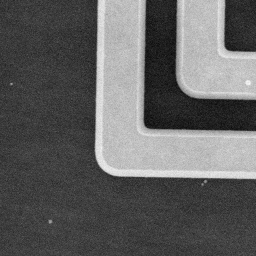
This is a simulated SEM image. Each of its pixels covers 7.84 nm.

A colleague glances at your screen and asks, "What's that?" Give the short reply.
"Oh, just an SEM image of groups of lines, slits or small figures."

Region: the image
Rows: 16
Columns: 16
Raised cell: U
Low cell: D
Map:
DDDDDDUUUDDUUUDD
DDDDDDUUUDDUUUDD
DDDDDDUUUDDUUUDD
DDDDDDUUUDDUUUUU
DDDDDDUUUDDUUUUU
DDDDDDUUUDDDUUUU
DDDDDDUUUDDDDDDD
DDDDDDUUUDDDDDDD
DDDDDDUUUUUUUUUU
DDDDDDUUUUUUUUUU
DDDDDDDUUUUUUUUU
DDDDDDDDDDDDDDDD
DDDDDDDDDDDDDDDD
DDDDDDDDDDDDDDDD
DDDDDDDDDDDDDDDD
DDDDDDDDDDDDDDDD